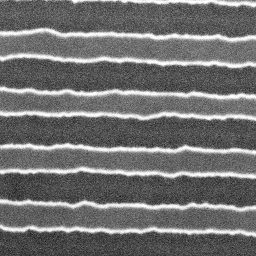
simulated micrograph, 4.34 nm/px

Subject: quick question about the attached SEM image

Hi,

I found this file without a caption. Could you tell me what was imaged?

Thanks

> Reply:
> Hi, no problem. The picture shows lines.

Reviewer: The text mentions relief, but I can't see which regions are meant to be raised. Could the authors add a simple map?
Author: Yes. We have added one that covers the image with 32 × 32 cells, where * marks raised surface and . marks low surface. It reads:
............................****
................................
................................
................................
*******************..***...*....
********************************
********************************
.......*************************
................................
................................
................................
*********....*****..............
********************************
********************************
..............******..**********
................................
................................
................................
************...*.......*........
********************************
********************************
*..*...**...********************
................................
................................
................................
********..**....................
********************************
********************************
********************************
................................
................................
................................